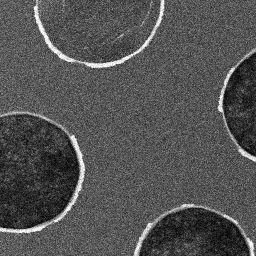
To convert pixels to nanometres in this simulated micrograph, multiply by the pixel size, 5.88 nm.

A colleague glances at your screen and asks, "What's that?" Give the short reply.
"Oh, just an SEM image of holes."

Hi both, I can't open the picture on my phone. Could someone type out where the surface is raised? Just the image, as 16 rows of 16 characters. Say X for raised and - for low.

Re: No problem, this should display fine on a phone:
XXX----XXXXXXXXX
XXXX--XXXXXXXXXX
XXXXXXXXXXXXXXXX
XXXXXXXXXXXXXXXX
XXXXXXXXXXXXXXX-
XXXXXXXXXXXXXX--
XXXXXXXXXXXXXX--
---XXXXXXXXXXX--
----XXXXXXXXXXX-
-----XXXXXXXXXX-
-----XXXXXXXXXXX
-----XXXXXXXXXXX
----XXXXXXXXXXXX
----XXXXXX----XX
XXXXXXXXX------X
XXXXXXXXX-------